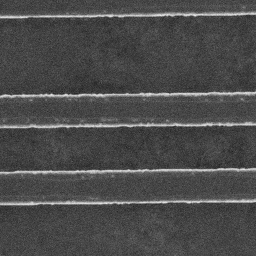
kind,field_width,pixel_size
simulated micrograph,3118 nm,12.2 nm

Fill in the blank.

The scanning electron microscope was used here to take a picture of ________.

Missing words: lines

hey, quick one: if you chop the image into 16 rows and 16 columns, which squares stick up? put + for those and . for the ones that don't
++++++++++++++++
................
................
................
................
................
++++++++++++++++
++++++++++++++++
................
................
................
++++++++++++++++
++++++++++++++++
................
................
................